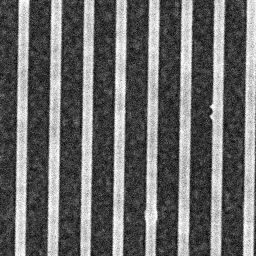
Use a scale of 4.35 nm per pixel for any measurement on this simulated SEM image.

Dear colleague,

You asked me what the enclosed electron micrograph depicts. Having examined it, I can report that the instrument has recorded parallel lines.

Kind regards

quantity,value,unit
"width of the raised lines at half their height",46.2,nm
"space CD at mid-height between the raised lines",96.7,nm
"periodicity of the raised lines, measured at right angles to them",0.142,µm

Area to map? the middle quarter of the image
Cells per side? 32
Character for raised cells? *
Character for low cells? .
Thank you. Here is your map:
.....**......**......***.....***
.....**......**......**......***
.....**......**......**......***
.....**......**......**......***
.....**......**......**......***
.....**......**......**......***
.....**......**......**......***
.....**......**......**......***
.....**......**......**......***
.....**......**......**......***
.....**......**......**......***
.....**......**......**......***
.....**......**......**......***
.....**......**......**......***
.....**......**......**......***
.....**......**......**......***
.....**......**......**......**.
.....**......**......**......**.
.....**......**......**......**.
.....**......**......**......**.
.....**......**......**......**.
.....**......**......**......**.
.....**......**......**......**.
.....**......**......**......**.
.....**......**......**......**.
.....**......**......**......**.
.....**......**......**......**.
.....**......**......**......**.
....***......**......**......**.
....***......**......**......**.
....***......**......**......**.
....***.....***......**......**.